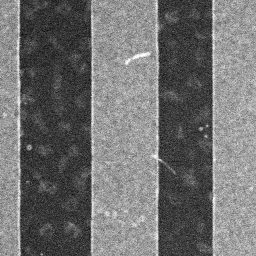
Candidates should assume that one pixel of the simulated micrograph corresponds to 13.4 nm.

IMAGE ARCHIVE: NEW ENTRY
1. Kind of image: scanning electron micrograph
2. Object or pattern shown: one or a few lines or trenches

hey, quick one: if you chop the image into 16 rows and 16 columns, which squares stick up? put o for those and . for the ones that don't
o.....oooo...ooo
o.....oooo...ooo
o.....oooo...ooo
o.....oooo...ooo
o.....oooo...ooo
o.....oooo...ooo
o.....oooo...ooo
o.....oooo...ooo
o.....oooo...ooo
o.....oooo...ooo
o.....oooo...ooo
o.....oooo...ooo
o.....oooo...ooo
o.....oooo...ooo
o.....oooo...ooo
o.....oooo...ooo